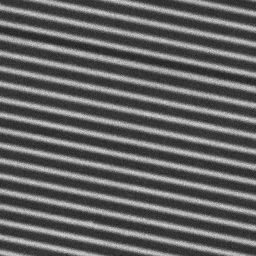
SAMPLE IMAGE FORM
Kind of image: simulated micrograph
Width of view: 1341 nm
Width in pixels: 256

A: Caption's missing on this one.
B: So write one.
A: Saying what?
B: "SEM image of parallel lines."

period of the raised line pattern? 78.5 nanometers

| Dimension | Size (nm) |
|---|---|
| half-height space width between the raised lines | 49.4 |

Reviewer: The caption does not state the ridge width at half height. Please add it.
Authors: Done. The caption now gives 0.0295 µm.